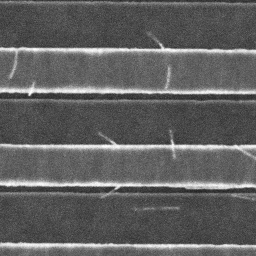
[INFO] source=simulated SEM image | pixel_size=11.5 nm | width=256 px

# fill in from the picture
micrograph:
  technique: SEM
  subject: lines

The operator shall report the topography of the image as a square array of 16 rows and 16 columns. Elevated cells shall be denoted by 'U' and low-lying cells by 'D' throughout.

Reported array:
DDDDDDDDDDDDDDDD
DDDDDDDDDDDDDDDD
DDDDDDDDDDDDDDDD
UUUUUUUUUUUUUUUU
UUUUUUUUUUUUUUUU
UUUUUUUUUUUUUUUU
DDDDDDDDDDDDDDDD
DDDDDDDDDDDDDDDD
DDDDDDDDDDDDDDDD
UUUUUUUUUUUUUUUU
UUUUUUUUUUUUUUUU
UUUUUUUUUUUUUUUU
DDDDDDDDDDDDDDDD
DDDDDDDDDDDDDDDD
DDDDDDDDDDDDDDDD
UUUUUUUUUUUUUUUU